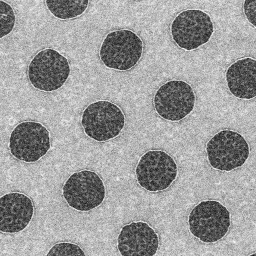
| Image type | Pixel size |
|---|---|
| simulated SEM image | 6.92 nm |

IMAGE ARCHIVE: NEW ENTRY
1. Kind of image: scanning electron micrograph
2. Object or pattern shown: a regular array of raised bodies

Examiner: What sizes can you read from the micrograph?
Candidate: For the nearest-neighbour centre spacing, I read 504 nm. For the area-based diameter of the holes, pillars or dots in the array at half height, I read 291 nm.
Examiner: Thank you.